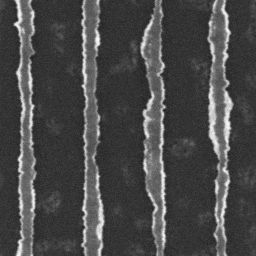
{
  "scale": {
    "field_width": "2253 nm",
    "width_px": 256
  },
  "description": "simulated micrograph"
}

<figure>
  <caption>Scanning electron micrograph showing one or a few lines or trenches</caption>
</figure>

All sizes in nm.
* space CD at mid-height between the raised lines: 460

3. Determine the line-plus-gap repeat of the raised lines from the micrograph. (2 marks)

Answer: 64.7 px